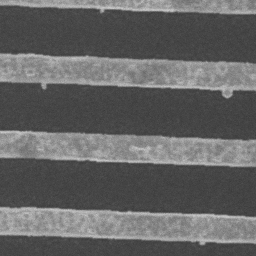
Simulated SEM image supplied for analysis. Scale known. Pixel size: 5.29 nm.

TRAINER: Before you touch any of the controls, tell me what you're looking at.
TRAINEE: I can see lines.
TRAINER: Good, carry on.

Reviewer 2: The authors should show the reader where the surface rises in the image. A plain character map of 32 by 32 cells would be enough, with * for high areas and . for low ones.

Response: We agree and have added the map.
...*****************************
.............................***
................................
................................
................................
................................
................................
*************...................
********************************
********************************
.............*******************
............................*...
................................
................................
................................
................................
.*..............................
*****************...............
********************************
......**************************
.........................*******
................................
................................
................................
................................
................................
***********.....................
********************************
********************************
...........*********************
................................
................................